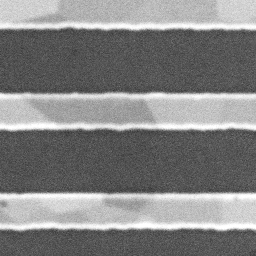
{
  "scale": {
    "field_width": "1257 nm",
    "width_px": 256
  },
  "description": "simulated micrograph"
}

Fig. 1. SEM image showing lines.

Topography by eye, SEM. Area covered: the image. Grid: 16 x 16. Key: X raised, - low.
XXXXXXXXXXXXXXXX
XXXXXXXXXXXXXXXX
----------------
----------------
----------------
----------------
XXXXXXXXXXXXXXXX
XXXXXXXXXXXXXXXX
----------------
----------------
----------------
----------------
XXXXXXXXXXXXXXXX
XXXXXXXXXXXXXXXX
----------------
----------------